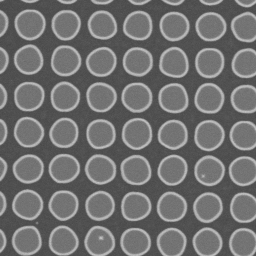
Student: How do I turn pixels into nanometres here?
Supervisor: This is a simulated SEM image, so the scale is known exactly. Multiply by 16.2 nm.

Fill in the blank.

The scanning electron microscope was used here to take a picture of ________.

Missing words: an array of small figures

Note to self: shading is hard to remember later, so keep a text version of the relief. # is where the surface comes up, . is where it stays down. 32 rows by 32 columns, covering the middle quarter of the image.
####..#######..#######..#######.
###...######...#######..#######.
##.....####.....#####....#####..
................................
................................
###....####.....#####....#####..
###...#######..#######..######..
####..#######.########..#######.
####..#######.########..#######.
####..#######..#######..#######.
###...######...######...#######.
##.....####.....####.....#####..
................................
................................
###....####.....#####.....###...
###...######...#######..######..
###...#######..#######..#######.
###...#######..#######..#######.
###...#######..#######..#######.
###...######...#######..#######.
##.....####.....####.....#####..
................................
................................
###....####.....####.....#####..
####..######...######...######..
####.########.#######...#######.
####.########.########.########.
####..#######.########.#######..
###...######...######...######..
#......####.....#####....####...
................................
................................